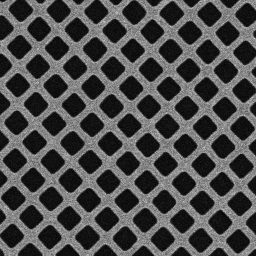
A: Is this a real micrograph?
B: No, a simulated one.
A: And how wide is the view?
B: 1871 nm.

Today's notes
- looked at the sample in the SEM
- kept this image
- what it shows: a regular array of holes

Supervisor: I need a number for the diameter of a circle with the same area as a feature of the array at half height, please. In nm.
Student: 159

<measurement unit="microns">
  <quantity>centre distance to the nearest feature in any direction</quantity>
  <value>0.193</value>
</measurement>